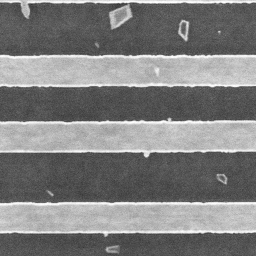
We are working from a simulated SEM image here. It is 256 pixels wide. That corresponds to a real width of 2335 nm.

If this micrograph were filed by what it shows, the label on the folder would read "lines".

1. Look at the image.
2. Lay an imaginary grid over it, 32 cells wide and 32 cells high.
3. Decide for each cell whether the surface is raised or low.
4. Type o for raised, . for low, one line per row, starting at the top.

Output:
...o............................
...o............................
................................
................................
................................
................................
................................
oooooooooooooooooooooooooooooooo
oooooooooooooooooooooooooooooooo
oooooooooooooooooooooooooooooooo
oooooooooooooooooooooooooooooooo
................................
................................
................................
................................
oooooooooooooooooooooooooooooooo
oooooooooooooooooooooooooooooooo
oooooooooooooooooooooooooooooooo
oooooooooooooooooooooooooooooooo
................................
................................
................................
................................
................................
................................
oooooooooooooooooooooooooooooooo
oooooooooooooooooooooooooooooooo
oooooooooooooooooooooooooooooooo
oooooooooooooooooooooooooooooooo
................................
................................
................................